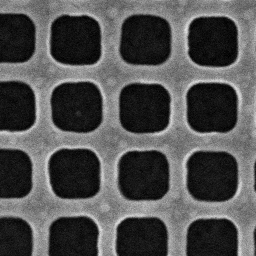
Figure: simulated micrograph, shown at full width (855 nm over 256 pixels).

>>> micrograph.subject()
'a regular array of holes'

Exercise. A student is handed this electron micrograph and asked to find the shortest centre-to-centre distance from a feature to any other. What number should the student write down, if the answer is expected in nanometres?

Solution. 223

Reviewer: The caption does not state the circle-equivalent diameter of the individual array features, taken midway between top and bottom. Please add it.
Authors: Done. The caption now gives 180 nm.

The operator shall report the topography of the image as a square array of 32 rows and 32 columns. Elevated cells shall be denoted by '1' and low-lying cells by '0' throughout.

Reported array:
11111111111111111111111111111111
11111111111111111111111111111111
00001110000011110000011100000111
00001100000011100000011100000011
00001100000001100000011000000011
00000100000001100000011100000011
00001100000001100000011100000011
00011110000011110000011100000111
11111111111111111111111111111111
11111111111111111111111111111111
00011111000011110011111110001111
00001110000001100000011000000111
00001100000001100000011000000011
00001100000001100000011000000011
00000110000001100000011000000011
00001110000001100000011100000011
10111111110111110000111110001111
11111111111111111111111111111111
11111111111111111111111111111111
00001100000011100000011100000111
00001100000011100000011000000011
00001100000001100000011000000011
00001100000011100000011000000011
00001100000011100000011000000011
00011110000011100000111100000111
11111111111111111111111111111111
11111111111111111111111111111111
00011110000011100000111110000111
00001100000011100000011100000011
00001100000011100000011000000011
00001100000011000000011000000011
00001100000011100000011000000011